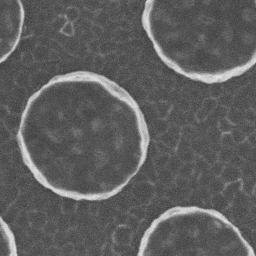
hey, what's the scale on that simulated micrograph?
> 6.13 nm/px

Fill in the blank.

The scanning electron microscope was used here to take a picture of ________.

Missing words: raised bodies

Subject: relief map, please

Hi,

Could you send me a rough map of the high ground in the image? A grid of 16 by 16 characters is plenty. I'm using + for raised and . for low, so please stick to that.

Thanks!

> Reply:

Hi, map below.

+........+++++++
+........+++++++
+.........++++++
..........++++++
...........++++.
...++++.........
..++++++........
.++++++++.......
.++++++++.......
..+++++++.......
..+++++++.......
...+++++........
................
..........++++..
+........++++++.
+........+++++++